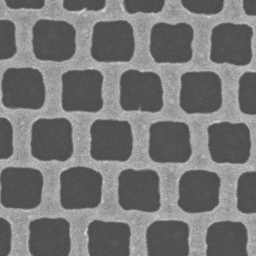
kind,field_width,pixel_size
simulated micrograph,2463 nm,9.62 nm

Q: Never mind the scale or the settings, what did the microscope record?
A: a regular array of holes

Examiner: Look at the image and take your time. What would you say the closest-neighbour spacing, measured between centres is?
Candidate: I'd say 551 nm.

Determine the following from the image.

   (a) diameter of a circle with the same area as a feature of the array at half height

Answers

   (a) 440 nm